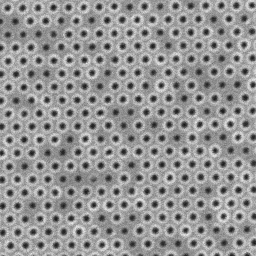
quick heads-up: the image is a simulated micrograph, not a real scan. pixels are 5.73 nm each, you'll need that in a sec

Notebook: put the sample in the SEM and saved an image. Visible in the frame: a regular array of holes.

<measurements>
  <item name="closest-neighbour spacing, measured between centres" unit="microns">0.0853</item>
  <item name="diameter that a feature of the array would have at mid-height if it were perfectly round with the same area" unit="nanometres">44.3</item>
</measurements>